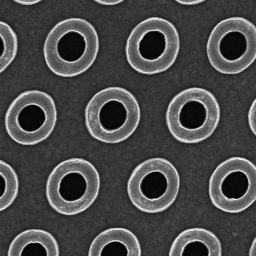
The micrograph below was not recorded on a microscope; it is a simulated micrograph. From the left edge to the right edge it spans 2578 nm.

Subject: ring-shaped raised bodies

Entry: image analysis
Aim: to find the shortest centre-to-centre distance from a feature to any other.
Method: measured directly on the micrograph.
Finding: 806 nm